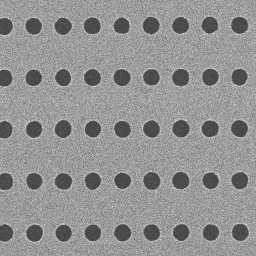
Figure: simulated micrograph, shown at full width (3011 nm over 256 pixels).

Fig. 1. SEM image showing a regular array of holes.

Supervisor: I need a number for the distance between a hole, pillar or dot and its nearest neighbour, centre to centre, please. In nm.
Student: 343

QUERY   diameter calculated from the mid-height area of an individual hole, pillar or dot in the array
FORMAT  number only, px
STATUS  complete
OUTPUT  16.7